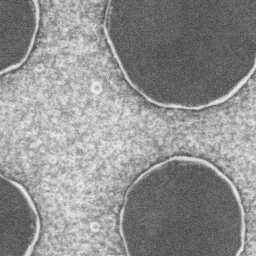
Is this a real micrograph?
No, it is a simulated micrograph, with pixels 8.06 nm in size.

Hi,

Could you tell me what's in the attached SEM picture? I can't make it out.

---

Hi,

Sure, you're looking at raised bodies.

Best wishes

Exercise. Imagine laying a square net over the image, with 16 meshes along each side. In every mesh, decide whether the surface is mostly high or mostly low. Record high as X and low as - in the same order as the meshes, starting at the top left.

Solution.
XX-----XXXXXXXXX
XX-----XXXXXXXXX
XX-----XXXXXXXXX
XX-----XXXXXXXXX
--------XXXXXXXX
--------XXXXXXX-
----------XXX---
----------------
----------------
----------------
----------XXX---
X-------XXXXXX--
XX------XXXXXXX-
XX------XXXXXXX-
XX------XXXXXXX-
XX------XXXXXXX-